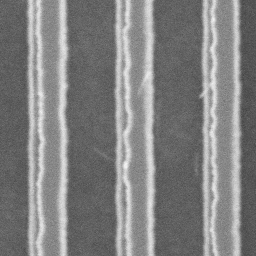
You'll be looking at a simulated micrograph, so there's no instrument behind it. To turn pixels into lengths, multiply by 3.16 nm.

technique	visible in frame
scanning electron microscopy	lines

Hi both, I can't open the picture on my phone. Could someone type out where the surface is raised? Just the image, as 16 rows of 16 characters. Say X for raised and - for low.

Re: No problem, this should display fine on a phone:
--XX---XX----XX-
--XX---XX----XX-
--XX---XX----XX-
--XX---XX----XX-
--XX---XX----XX-
--XX---XX----XX-
--XX---XX----XX-
--XX---XX----XX-
--XX---XX----XX-
--XX---XX----XX-
--XX---XXX---XX-
--XX---XXX---XX-
--XX---XX----XX-
--XX---XX----XX-
--XX---XX----XX-
--XX---XXX---XX-